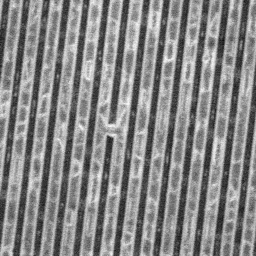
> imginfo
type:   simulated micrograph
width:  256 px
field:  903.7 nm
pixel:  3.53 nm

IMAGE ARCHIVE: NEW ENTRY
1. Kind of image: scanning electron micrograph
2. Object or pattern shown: parallel lines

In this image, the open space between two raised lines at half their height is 7.82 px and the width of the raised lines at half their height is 42.5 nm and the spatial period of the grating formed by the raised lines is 70.1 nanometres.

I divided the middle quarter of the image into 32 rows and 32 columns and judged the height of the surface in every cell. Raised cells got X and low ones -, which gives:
XX---XXX--XXX--XXX--XXX--XXX--XX
XX---XX---XX---XX---XX---XX---XX
XX---XX---XX---XX---XX--XXX---XX
XX--XXX--XXX--XXX---XX--XXX---XX
XX--XXX--XXX--XXX--XXX--XXX--XXX
XX--XXX--XXX--XXX--XXX--XXX--XXX
XX--XXX--XXX--XXX--XXX--XXX--XXX
XX--XXX--XXX--XXX--XXX--XXX--XXX
XX--XXX--XXX--XXX--XXX--XXX--XXX
X---XX---XX---XX---XX---XX---XX-
X---XX---XX---XX---XX---XX---XX-
X---XX---XX---XX---XX---XX---XX-
X--XXX--XXX--XXX--XXX--XXX--XXX-
X--XXX--XXX--XXX--XXX--XXX--XXX-
X--XXX--XXX--XXX--XXX--XXX--XXX-
X--XXX--XXXXXXXX--XXX--XXX--XXX-
X--XXX--XXXXXXXX--XXX--XXX--XXX-
---XX---XXXXXXXX--XXX--XXX--XXX-
---XX---XX---XX---XX---XX---XX--
---XX---XX---XX---XX---XX--XXX--
--XXX--XXX--XXX--XXX--XXX--XXX--
--XXX--XXX--XXX--XXX--XXX--XXX--
--XXX--XXX--XXX--XXX--XXX--XXX--
--XXX--XXX--XXX--XXX--XXX--XXX--
--XXX--XXX--XXX--XXX--XXX--XXX--
--XXX--XXX--XXX--XXX--XXX--XXX--
--XX---XX---XX---XX---XX---XX---
--XX---XX---XX---XX---XX--XXX--X
--XX---XX---XX---XX---XX---XX--X
-XXX--XXX--XXX--XXX--XXX--XXX--X
-XXX--XXX--XXX--XXX--XXX--XXX--X
-XXX--XXX--XXX--XXX--XXX--XXX--X